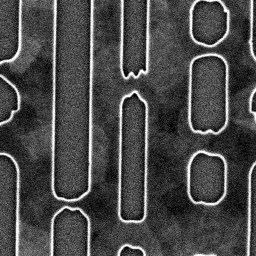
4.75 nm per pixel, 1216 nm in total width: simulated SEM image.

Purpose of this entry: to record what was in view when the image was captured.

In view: one or a few lines or trenches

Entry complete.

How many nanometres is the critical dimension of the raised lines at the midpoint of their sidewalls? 169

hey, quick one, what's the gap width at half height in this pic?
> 169 nm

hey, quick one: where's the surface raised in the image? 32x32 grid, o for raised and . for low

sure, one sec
...oooo.....ooo....ooooo....ooo.
...oooo.....ooo....ooooo....ooo.
..ooooo....oooo....ooooo.....oo.
..ooooo....oooo....ooooo....ooo.
..ooooo....oooo....ooooo....ooo.
..ooooo....oooo....oooooo..oooo.
..ooooo....oooo...ooooooooooooo.
.oooooo....oooo...oooooo....oooo
ooooooo....oooo...oooooo....oooo
ooooooo....ooooooooooooo....oooo
.oooooo....ooooooooooooo....oooo
..ooooo....ooooooooooooo....oooo
..ooooo....oooo...oooooo....ooo.
..ooooo....oooo...oooooo....ooo.
.oooooo....oooo...oooooo....oooo
ooooooo....oooo...oooooo....oooo
ooooooo....oooo...ooooooo.oooooo
ooooooo....oooo...oooooooooooooo
ooooooo....oooo...oooooooooooooo
.oooooo....oooo...oooooo...ooooo
..ooooo....oooo...oooooo....oooo
..ooooo....oooo...oooooo....ooo.
..ooooo....oooo...oooooo....ooo.
..ooooo....oooo...oooooo....ooo.
..ooooo...ooooo...oooooo....ooo.
..ooooooooooooo...ooooooooooooo.
..ooooo...ooooo...ooooooooooooo.
..ooooo....oooo...ooooooooooooo.
..ooooo....oooooooooooooooooooo.
..ooooo....oooooooooooooooooooo.
..ooooo....oooooooooooooooooooo.
..ooooo....oooo...ooooooooooooo.